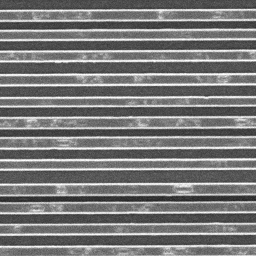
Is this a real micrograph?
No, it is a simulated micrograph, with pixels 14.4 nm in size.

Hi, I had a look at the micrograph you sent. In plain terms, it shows parallel lines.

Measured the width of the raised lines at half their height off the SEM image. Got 157 nanometres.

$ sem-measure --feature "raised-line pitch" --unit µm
0.308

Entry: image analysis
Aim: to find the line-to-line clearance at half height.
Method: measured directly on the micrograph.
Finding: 0.157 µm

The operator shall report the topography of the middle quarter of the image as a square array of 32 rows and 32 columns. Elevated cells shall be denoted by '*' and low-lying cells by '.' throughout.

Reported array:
................................
................................
.....................*..........
********************************
********************************
................................
................................
................................
********************************
********************************
*..**....*...******..........***
................................
................................
************..**.***************
********************************
********************************
................................
................................
********************************
********************************
********************************
................................
................................
................................
********************************
********************************
................................
................................
................................
................................
********************************
********************************